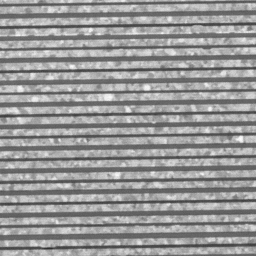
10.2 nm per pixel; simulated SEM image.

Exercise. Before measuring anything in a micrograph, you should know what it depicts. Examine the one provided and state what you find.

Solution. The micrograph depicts parallel lines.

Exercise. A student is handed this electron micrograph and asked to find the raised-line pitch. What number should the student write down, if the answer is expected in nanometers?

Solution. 113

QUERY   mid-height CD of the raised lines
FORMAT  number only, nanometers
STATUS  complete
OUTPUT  67.7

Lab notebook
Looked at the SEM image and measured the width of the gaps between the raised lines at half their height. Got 39.6 nm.